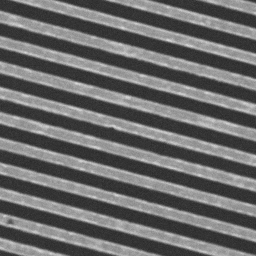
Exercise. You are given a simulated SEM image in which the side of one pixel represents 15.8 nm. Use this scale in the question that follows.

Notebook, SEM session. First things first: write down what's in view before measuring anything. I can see parallel lines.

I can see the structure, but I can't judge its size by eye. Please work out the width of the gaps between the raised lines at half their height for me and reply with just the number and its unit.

223 nm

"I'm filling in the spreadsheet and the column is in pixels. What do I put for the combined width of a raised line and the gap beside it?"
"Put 24.4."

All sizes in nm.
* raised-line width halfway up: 152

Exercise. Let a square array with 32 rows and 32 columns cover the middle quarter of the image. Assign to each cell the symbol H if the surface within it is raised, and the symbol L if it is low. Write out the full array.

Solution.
LLHHHHHHHHHLLLLLLLLLLLLLLLHHHHHH
LLLLLHHHHHHHHHHLLLLLLLLLLLLLLLHH
LLLLLLLLLHHHHHHHHHHLLLLLLLLLLLLL
LLLLLLLLLLLLLHHHHHHHHHHLLLLLLLLL
HHHLLLLLLLLLLLLLLHHHHHHHHHLLLLLL
HHHHHHHLLLLLLLLLLLLLLHHHHHHHHHLL
LHHHHHHHHHLLLLLLLLLLLLLLHHHHHHHH
LLLLLHHHHHHHHHLLLLLLLLLLLLLLHHHH
LLLLLLLLLHHHHHHHHHLLLLLLLLLLLLLL
LLLLLLLLLLLLHHHHHHHHHHLLLLLLLLLL
HLLLLLLLLLLLLLLLHHHHHHHHHLLLLLLL
HHHHHLLLLLLLLLLLLLLLHHHHHHHHHLLL
HHHHHHHHHLLLLLLLLLLLLLLLHHHHHHHH
LLLHHHHHHHHHLLLLLLLLLLLLLLLHHHHH
LLLLLLLHHHHHHHHHLLLLLLLLLLLLLLLH
LLLLLLLLLLHHHHHHHHHHLLLLLLLLLLLL
LLLLLLLLLLLLLLLHHHHHHHHHLLLLLLLL
HHHHLLLLLLLLLLLLLLHHHHHHHHHHLLLL
HHHHHHHLLLLLLLLLLLLLLHHHHHHHHHHL
LLHHHHHHHHHLLLLLLLLLLLLLLLHHHHHH
LLLLLLHHHHHHHHHLLLLLLLLLLLLLLLHH
LLLLLLLLLHHHHHHHHHHLLLLLLLLLLLLL
LLLLLLLLLLLLLHHHHHHHHHLLLLLLLLLL
HHHLLLLLLLLLLLLLLHHHHHHHHHLLLLLL
HHHHHHHLLLLLLLLLLLLLLHHHHHHHHHLL
HHHHHHHHHHLLLLLLLLLLLLLLHHHHHHHH
LLLLHHHHHHHHHHLLLLLLLLLLLLLLHHHH
LLLLLLLLHHHHHHHHHLLLLLLLLLLLLLLL
LLLLLLLLLLLLHHHHHHHHHHLLLLLLLLLL
HHLLLLLLLLLLLLLLHHHHHHHHHHLLLLLL
HHHHHLLLLLLLLLLLLLLLHHHHHHHHHLLL
HHHHHHHHHLLLLLLLLLLLLLLHHHHHHHHH